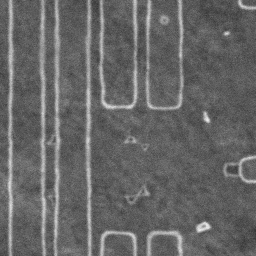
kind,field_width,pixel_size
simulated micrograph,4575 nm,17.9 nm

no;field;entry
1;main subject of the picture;wiring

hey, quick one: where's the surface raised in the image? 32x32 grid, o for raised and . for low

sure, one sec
.oooo..oooo..oooo..ooo........oo
.oooo..oooo..oooo..ooo..........
.oooo..oooo..oooo..oooo.........
.oooo..oooo..oooo.ooooo.........
.oooo..oooo..oooo.ooooo.........
.oooo..oooo..oooo.ooooo.........
.oooo..oooo..oooo.ooooo.........
.oooo..oooo..oooo.ooooo.........
.oooo..oooo..oooo.ooooo.........
.oooo..oooo..oooo.ooooo.........
.oooo..oooo..oooo.ooooo.........
.oooo..oooo..oooo.ooooo.........
.oooo..oooo..oooo.ooooo.........
.oooo..oooo........ooo..........
.oooo..oooo.....................
.oooo..oooo.....................
.oooo..oooo.....................
.oooo..oooo.....................
.oooo..oooo.....................
.oooo..oooo.....................
.oooo..oooo...................oo
.oooo..oooo...................oo
.oooo..oooo....................o
.oooo..oooo.....................
.oooo..oooo.....................
.oooo..oooo.....................
.oooo..oooo.....................
.oooo..oooo.....................
.oooo..oooo..............o......
.oooo..oooo..ooo...ooo..........
.oooo..oooo..oooo..ooo..........
.ooooo.oooo..oooo..oooo.........